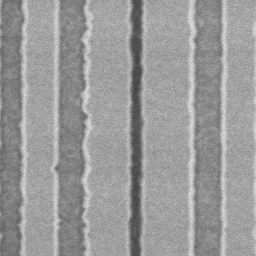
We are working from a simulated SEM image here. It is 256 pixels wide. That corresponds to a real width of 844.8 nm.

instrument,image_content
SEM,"one or a few lines or trenches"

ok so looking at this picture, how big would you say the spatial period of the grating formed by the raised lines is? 0.21 µm